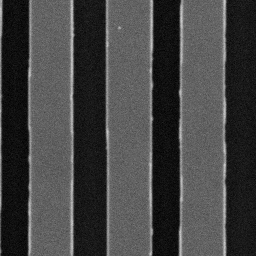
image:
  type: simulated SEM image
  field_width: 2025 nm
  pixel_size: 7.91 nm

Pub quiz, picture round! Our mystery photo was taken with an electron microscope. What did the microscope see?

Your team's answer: lines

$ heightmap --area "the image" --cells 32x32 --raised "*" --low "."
....*****....******....*****....
....*****....******....*****....
....*****....******....*****....
....*****....******....*****....
....*****....******....*****....
....*****....******....*****....
....*****....******....*****....
....*****....******....*****....
....*****....******....*****....
....*****....******....*****....
....*****....******....*****....
....*****....******...******....
....*****....******....*****....
....*****....******....*****....
....*****....******....*****....
....*****....******...******....
....*****....******...******....
....*****....******...******....
....*****....******....*****....
....*****....******....*****....
....*****....******....*****....
....*****....******....*****....
....*****....******....*****....
....*****....******....*****....
....*****....******....*****....
....*****....******....*****....
....*****....******....*****....
....*****....******....*****....
....*****....******...******....
....*****....******...******....
....*****....******...******....
....*****....******...******....